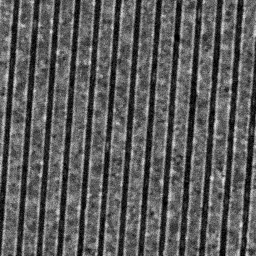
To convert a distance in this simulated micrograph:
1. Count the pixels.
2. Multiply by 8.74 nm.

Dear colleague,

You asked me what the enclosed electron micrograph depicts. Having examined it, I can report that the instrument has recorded parallel lines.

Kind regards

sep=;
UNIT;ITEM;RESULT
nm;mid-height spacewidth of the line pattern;64.3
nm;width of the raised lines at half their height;112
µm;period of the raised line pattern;0.178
